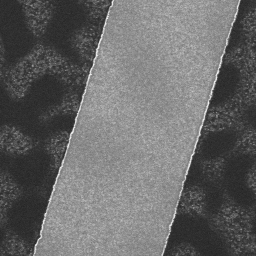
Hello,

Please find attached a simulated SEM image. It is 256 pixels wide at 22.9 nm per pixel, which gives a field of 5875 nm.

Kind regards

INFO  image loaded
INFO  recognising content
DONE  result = one or a few lines or trenches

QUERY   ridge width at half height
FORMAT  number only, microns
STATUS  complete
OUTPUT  2.79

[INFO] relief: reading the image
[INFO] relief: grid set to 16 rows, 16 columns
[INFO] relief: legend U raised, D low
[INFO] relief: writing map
DDDDDDDUUUUUUUUD
DDDDDDDUUUUUUUUD
DDDDDDUUUUUUUUDD
DDDDDDUUUUUUUUDD
DDDDDDUUUUUUUUDD
DDDDDUUUUUUUUDDD
DDDDDUUUUUUUUDDD
DDDDDUUUUUUUUDDD
DDDDUUUUUUUUDDDD
DDDDUUUUUUUUDDDD
DDDDUUUUUUUUDDDD
DDDUUUUUUUUDDDDD
DDDUUUUUUUUDDDDD
DDDUUUUUUUUDDDDD
DDDUUUUUUUUDDDDD
DDUUUUUUUUDDDDDD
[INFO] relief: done